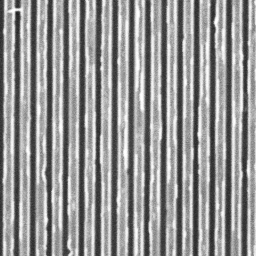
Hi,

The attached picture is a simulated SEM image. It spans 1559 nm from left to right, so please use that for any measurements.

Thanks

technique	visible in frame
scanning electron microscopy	parallel lines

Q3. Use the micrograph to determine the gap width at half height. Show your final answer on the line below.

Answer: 0.0381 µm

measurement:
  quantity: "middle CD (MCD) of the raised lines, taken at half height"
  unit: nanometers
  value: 59.4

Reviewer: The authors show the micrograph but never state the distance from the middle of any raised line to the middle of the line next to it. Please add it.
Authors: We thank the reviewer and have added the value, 99.2 nm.